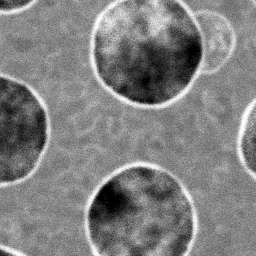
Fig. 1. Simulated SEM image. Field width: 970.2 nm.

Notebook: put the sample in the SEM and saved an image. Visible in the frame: holes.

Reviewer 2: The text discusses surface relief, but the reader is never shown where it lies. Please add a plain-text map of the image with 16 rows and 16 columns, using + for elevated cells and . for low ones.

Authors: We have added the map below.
.++++++.....++++
++++++......++++
++++++.......+++
++++++.......+++
++++++......++++
..+++++.....++++
...++++++.++++++
...++++++++++++.
...++++++++++++.
...++++++++++++.
..++++++..++++++
++++++.....+++++
++++++......++++
+++++.......++++
++++++......++++
++++++......++++